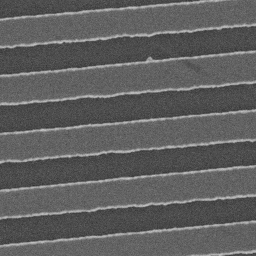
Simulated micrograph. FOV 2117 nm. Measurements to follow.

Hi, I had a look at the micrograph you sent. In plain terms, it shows lines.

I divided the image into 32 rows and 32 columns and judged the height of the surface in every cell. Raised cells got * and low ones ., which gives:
.....................***********
..........**********************
********************************
****************************....
*****************...............
*****...........................
...............................*
....................************
..........**********************
********************************
******************************..
*******************.............
********........................
................................
.......................*********
.............*******************
...*****************************
********************************
*********************...........
*********.......................
................................
........................********
.............*******************
...*****************************
********************************
*********************...........
*********.......................
................................
.......................*********
............********************
..******************************
********************************